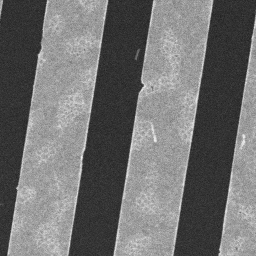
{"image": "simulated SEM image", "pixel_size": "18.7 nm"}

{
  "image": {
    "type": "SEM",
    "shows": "one or a few lines or trenches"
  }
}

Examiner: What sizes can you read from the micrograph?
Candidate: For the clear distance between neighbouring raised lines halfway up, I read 0.845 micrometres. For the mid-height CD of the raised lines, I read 1100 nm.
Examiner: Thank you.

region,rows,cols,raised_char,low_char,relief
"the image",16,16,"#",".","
...####...###...
...####..####...
...###...####...
..####...####...
..####...####..#
..####...###...#
..####...###...#
..####..####...#
..###...####...#
.####...####...#
.####...####...#
.####...###...##
.####...###...##
.####..####...##
.###...####...##
.###...####...##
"